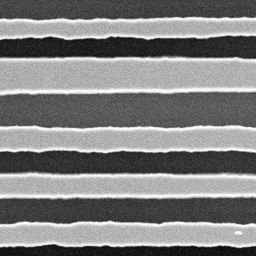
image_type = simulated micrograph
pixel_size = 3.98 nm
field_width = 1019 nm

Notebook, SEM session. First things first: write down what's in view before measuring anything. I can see lines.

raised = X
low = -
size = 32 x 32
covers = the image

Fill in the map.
--------------------------------
--------------------------------
XXXX--XXX-XXXXXX-XXXXXXXXXXXXXXX
XXXXXXXXXXXXXXXXXXXXXXXXXXXXXXXX
XXXXXXXXXXXXXXXXXXXXXXXXXXX-----
--------------------------------
--------------------------------
XXXXXXXXXXXXXXXXXXXXXXXXXXXXXXXX
XXXXXXXXXXXXXXXXXXXXXXXXXXXXXXXX
XXXXXXXXXXXXXXXXXXXXXXXXXXXXXXXX
XXXXXXXXXXXXXXXXXXXXXXXXXXXXXXXX
XXXXXXXXXXXX--------------------
--------------------------------
--------------------------------
--------------------------------
--------------------------------
XXXXXXXXXXXXXXXXXXXXXXXXXXXXXXXX
XXXXXXXXXXXXXXXXXXXXXXXXXXXXXXXX
XXXXXXXXXXXXXXXXXXXXXXXXXXXXXXXX
--------------------------------
--------------------------------
--------------------------------
XXXXXXXXXXXXXXXXXXXXXXXXXXXXXXXX
XXXXXXXXXXXXXXXXXXXXXXXXXXXXXXXX
XXXXXXXXXXXXXXXXXXXXXXXXXXXXXXX-
--------------------------------
--------------------------------
--------------------------------
XXXXXXXXXXXXXXXXXXXXXXXXXXXXXXXX
XXXXXXXXXXXXXXXXXXXXXXXXXXXXXXXX
XXXXXX-XXXXXXXXXXXXXXXXXXXXXXXXX
--------------------------------